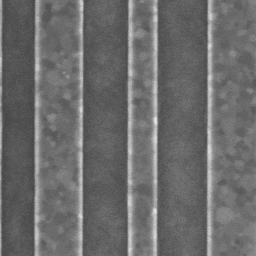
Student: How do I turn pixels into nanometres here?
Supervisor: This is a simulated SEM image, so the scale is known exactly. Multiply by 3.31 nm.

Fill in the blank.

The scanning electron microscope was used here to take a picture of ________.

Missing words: one or a few lines or trenches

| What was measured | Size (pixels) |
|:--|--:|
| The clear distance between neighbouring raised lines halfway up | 48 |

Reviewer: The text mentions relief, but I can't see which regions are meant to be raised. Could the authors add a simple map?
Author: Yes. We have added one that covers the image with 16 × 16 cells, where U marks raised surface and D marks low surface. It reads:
DDUUUDDDUUDDDUUU
DDUUUDDDUUDDDUUU
DDUUUDDDUUDDDUUU
DDUUUDDDUUDDDUUU
DDUUUDDDUUDDDUUU
DDUUUDDDUUDDDUUU
DDUUUDDDUUDDDUUU
DDUUUDDDUUDDDUUU
DDUUUDDDUUDDDUUU
DDUUUDDDUUDDDUUU
DDUUUDDDUUDDDUUU
DDUUUDDDUUDDDUUU
DDUUUDDDUUDDDUUU
DDUUUDDDUUDDDUUU
DDUUUDDDUUDDDUUU
DDUUUDDDUUDDDUUU